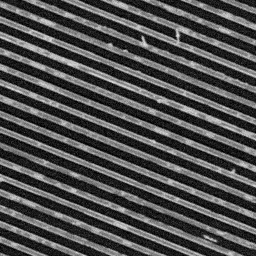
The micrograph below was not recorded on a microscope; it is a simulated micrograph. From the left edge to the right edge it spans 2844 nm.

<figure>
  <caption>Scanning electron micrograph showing parallel lines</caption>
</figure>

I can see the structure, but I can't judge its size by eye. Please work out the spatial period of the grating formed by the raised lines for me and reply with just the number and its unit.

0.162 microns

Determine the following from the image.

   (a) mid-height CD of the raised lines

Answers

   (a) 51.5 nm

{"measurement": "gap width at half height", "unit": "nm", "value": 113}